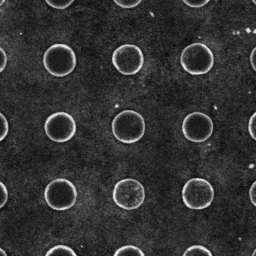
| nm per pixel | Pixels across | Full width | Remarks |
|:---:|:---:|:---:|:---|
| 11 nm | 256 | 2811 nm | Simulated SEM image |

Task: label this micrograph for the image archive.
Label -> a regular array of raised bodies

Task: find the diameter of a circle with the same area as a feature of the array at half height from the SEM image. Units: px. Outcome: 31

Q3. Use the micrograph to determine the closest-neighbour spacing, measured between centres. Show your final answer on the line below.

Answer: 67.2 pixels